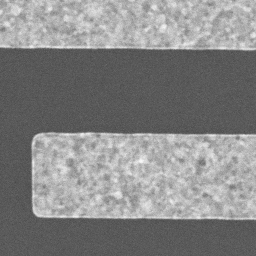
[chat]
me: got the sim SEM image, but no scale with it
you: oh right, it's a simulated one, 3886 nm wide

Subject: wiring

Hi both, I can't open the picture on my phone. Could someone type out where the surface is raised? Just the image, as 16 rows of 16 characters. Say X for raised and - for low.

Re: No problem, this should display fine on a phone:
XXXXXXXXXXXXXXXX
XXXXXXXXXXXXXXXX
XXXXXXXXXXXXXXXX
----------------
----------------
----------------
----------------
----------------
--XXXXXXXXXXXXXX
--XXXXXXXXXXXXXX
--XXXXXXXXXXXXXX
--XXXXXXXXXXXXXX
--XXXXXXXXXXXXXX
---XXXXXXXXXXXXX
----------------
----------------